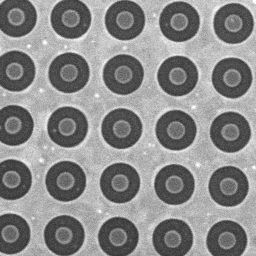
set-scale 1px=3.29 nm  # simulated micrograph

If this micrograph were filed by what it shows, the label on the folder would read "an array of small figures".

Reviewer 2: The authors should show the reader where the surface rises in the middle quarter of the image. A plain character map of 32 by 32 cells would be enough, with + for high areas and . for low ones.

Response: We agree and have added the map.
++....++++..........++++........
+++....++....++++...+++....+++..
+++....++....++++...+++....+++..
+++....++....++++...+++....+++..
......++++....+.....+++....+++..
.....+++++.........+++++........
....+++++++.......+++++++.......
..+++++++++++....+++++++++.....+
++++++++++++++++++++++++++++++++
++++++++++++++++++++++++++++++++
..++++++++++++++++++++++++++++++
....++++++++....+++++++.+++..+++
.....++++++.......+++++++......+
......++++.........+++++........
++....+++.....+.....+++....+....
+++...+++....+++....+++...++++..
+++...+.+....+++....++....++++..
++....+++....+++....+++...++++..
.....+++++.........++++....++...
.....+++++.........+++++........
....+++++.+......++++++++.......
+++++++++++++++++++++++++++...++
++++++++++++++++++++++++.+++++++
+++++++++++++++++++++++..+++++++
...+++++++++++++++++++..++++++++
....+++++++......++++...+.....++
.....+++++........+++..+.......+
++...++++..........++++.........
++....+++...+++....++++...+++...
++....+++...++++...+++....+++...
++....+++...++++...+++....++++..
.....++++....+.....++++...+++...